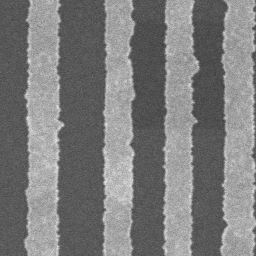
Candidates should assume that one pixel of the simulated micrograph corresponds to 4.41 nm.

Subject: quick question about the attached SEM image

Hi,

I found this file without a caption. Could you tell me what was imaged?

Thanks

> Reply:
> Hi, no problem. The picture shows one or a few lines or trenches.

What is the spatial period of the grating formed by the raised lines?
0.289 microns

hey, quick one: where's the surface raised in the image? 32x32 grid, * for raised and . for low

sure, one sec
....***......***.....***....****
....***......***.....***....****
....***......****....***....****
....***......****....***....****
....***......***.....***....****
....***......***.....***....****
...****......***.....***....****
....***......***.....****...****
....***......***.....****...****
....***......***.....***....****
....***......****....***....****
...****......****....***....****
...****......****....***....****
...****......***.....***....****
...****......***.....***....****
...*****.....***.....***....****
....***......***.....***....****
....***......**......***....****
....***......**......***....***.
....***......****....***....***.
....***......****....***....****
....***......***.....***....****
....***......****....***....****
....***......***.....***....****
...****......***.....***....****
....***......***.....***....****
....***......***.....***....****
....***......***.....***....*.**
....***......***.....***....****
...****......***.....***....****
...****......***.....***....****
...****......***.....***....****